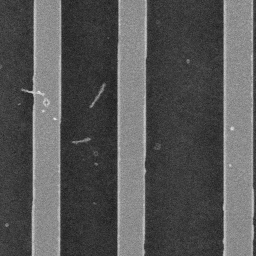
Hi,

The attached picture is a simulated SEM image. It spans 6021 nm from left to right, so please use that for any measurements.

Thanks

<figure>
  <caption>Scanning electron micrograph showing lines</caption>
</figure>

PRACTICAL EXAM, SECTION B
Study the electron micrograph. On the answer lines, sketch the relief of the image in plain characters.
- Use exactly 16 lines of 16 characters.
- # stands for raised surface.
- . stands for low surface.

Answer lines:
..##...##.....##
..##...##.....##
..##...##.....##
..##...##.....##
..##...##.....##
..##...##.....##
..##...##.....##
..##...##.....##
..##...##.....##
..##...##.....##
..##...##.....##
..##...##.....##
..##...##.....##
..##...##.....##
..##...##.....##
..##...##.....##